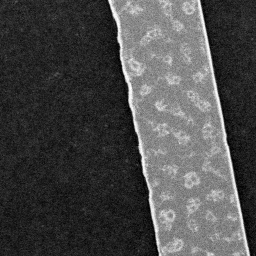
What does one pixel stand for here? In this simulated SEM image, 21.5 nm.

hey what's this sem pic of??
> one or a few lines or trenches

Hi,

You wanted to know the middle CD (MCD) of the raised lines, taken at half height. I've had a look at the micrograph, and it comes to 1850 nm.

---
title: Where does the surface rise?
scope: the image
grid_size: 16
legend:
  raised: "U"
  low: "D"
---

DDDDDDDUUUUUUDDD
DDDDDDDUUUUUUDDD
DDDDDDDUUUUUUDDD
DDDDDDDDUUUUUDDD
DDDDDDDDUUUUUDDD
DDDDDDDDUUUUUDDD
DDDDDDDDUUUUUUDD
DDDDDDDDUUUUUUDD
DDDDDDDDDUUUUUDD
DDDDDDDDDUUUUUDD
DDDDDDDDDUUUUUDD
DDDDDDDDDUUUUUUD
DDDDDDDDDUUUUUUD
DDDDDDDDDDUUUUUD
DDDDDDDDDDUUUUUD
DDDDDDDDDDUUUUUD